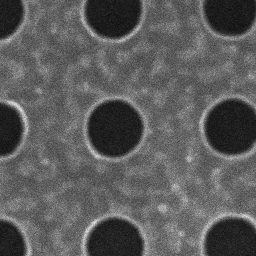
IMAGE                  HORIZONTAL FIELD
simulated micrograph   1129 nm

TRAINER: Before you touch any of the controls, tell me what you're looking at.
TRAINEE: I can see holes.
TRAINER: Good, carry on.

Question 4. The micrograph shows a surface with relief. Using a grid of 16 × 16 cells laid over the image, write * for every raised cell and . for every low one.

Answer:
..***....****...
.*****...****...
****************
****************
****************
****************
******..******.*
.*****...****...
.*****...****...
.*****..******.*
****************
****************
****************
****************
.*****...****...
..***....****...